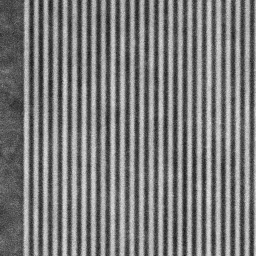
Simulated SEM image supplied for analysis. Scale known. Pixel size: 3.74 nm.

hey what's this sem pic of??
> parallel lines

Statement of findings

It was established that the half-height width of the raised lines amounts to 11.2 nanometres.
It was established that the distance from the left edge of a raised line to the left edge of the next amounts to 0.0359 um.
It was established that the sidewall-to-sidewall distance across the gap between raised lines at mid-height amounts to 22.5 nm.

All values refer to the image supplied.